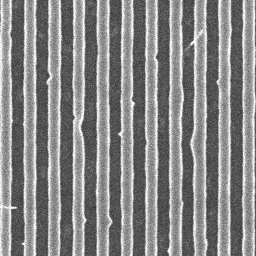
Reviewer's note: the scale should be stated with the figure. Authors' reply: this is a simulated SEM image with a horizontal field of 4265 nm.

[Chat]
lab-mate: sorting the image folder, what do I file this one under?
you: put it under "parallel lines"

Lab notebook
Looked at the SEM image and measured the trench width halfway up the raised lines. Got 221 nanometres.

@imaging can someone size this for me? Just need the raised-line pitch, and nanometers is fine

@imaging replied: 405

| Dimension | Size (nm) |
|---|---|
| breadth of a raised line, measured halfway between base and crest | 190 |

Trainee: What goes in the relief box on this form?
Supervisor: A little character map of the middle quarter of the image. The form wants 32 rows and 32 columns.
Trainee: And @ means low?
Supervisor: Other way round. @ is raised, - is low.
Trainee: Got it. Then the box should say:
---@@---@@@---@@@---@@@----@@---
--@@@---@@@----@@----@@----@@---
--@@@---@@@----@@----@@----@@---
--@@@---@@@----@@----@@----@@---
--@@@---@@@---@@@----@@----@@---
--@@@---@@@---@@@----@@----@@---
--@@@---@@@---@@@----@@----@@@--
---@@---@@@---@@@----@@----@@@--
---@@---@@@---@@@----@@----@@@--
---@@---@@@---@@@----@@----@@@--
---@@---@@@---@@@----@@----@@@--
---@@---@@@---@@@----@@----@@---
---@@---@@@---@@@----@@----@@---
---@@---@@@---@@@----@@----@@---
---@----@@@---@@@----@@----@@---
---@----@@@----@@----@@---@@@---
---@----@@@----@@----@@---@@@---
---@----@@@---@@@----@@---@@@---
---@@---@@@---@@@----@@---@@@---
---@@---@@@---@@@----@@----@@---
---@@---@@@---@@@----@@---@@@---
---@@---@@@---@@@----@@---@@@---
---@@---@@@---@@@----@@----@@---
---@@---@@@---@@@----@@----@@---
---@@---@@@---@@@----@@----@@---
--@@@---@@@----@@----@@----@@---
--@@@---@@@----@@----@@---@@@---
--@@@---@@@----@@----@@---@@@---
--@@@---@@@----@@----@@---@@@---
--@@@---@@@---@@@----@@----@@---
--@@@---@@@---@@@----@@----@@---
--@@@---@@@---@@@----@@----@@---